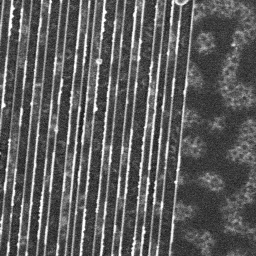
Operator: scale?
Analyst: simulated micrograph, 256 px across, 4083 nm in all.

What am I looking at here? parallel lines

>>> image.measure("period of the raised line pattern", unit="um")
0.298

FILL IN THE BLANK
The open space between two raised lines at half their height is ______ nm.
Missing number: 163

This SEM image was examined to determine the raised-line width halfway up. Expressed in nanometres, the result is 147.